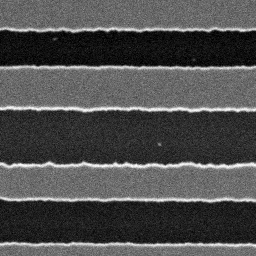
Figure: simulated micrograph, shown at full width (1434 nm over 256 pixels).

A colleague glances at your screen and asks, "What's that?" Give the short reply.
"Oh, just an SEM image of lines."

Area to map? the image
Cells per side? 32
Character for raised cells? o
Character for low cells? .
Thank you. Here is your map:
oooooooooooooooooooooooooooooooo
oooooooooooooooooooooooooooooooo
oooooooooooooooooooooooooooooooo
oooooooooooooooooooooooooooooooo
................................
................................
................................
................................
oooooooooooooooooooooooooooooooo
oooooooooooooooooooooooooooooooo
oooooooooooooooooooooooooooooooo
oooooooooooooooooooooooooooooooo
oooooooooooooooooooooooooooooooo
ooo.oooooooooooooooooooooooooooo
................................
................................
................................
................................
................................
................................
......o...o............o........
oooooooooooooooooooooooooooooooo
oooooooooooooooooooooooooooooooo
oooooooooooooooooooooooooooooooo
oooooooooooooooooooooooooooooooo
................................
................................
................................
................................
................................
oooo.....oo...oo................
oooooooooooooooooooooooooooooooo